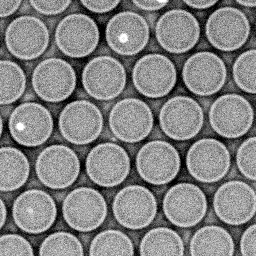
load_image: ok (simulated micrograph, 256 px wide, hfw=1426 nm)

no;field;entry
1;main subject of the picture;an array of small figures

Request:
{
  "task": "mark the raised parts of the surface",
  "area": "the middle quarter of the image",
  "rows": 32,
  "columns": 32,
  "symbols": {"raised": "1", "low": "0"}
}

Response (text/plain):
11000011111111000011111111100011
11000111111111100111111111110011
11100111111111100111111111110011
11100111111111100111111111110011
11100111111111100111111111110011
11100111111111100011111111100001
11000011111111000001111111100000
11000011111111000000111111000000
00000000111100000000000000011110
00011100000000111111000000111111
01111111000001111111100001111111
11111111100011111111100011111111
11111111100011111111110011111111
11111111110111111111110011111111
11111111110111111111110011111111
11111111100011111111110011111111
11111111100011111111110001111111
11111111100001111111100000111111
11111111000000111111000000011110
00111100000000000000001110000000
00000000011111000000111111100000
11000001111111100001111111110001
11100011111111110001111111110001
11100011111111110011111111111001
11110011111111110011111111111001
11110011111111110011111111111001
11110011111111110011111111111001
11100011111111110001111111110000
11100001111111100000111111100000
11000000111111000000011111000000
10000000000100000000000000001111
00011111000000111111100000111111